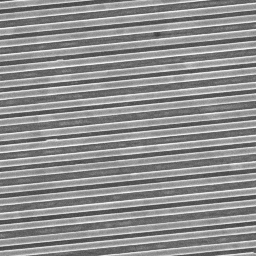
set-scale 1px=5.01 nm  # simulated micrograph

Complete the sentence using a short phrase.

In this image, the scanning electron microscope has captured parallel lines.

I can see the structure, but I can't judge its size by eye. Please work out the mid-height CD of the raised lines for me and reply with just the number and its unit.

0.0349 micrometres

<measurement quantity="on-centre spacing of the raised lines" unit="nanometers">65.6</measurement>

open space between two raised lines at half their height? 26.8 nm